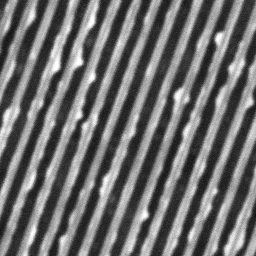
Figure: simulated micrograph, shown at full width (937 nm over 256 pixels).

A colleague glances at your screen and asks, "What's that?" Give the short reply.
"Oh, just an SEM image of parallel lines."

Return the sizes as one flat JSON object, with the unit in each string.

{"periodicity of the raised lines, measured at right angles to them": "71.2 nm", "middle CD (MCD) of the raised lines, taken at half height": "28.7 nanometers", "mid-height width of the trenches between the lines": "0.0406 micrometres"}